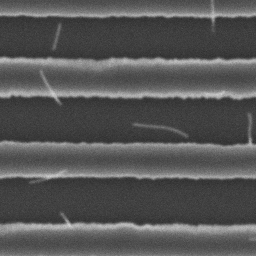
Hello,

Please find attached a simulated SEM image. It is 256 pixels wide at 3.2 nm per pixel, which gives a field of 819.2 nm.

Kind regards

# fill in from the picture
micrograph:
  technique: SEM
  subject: lines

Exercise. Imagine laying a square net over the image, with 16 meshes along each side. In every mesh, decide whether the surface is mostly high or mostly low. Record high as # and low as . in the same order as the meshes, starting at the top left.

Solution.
################
................
................
................
################
################
................
................
................
################
################
................
................
................
################
################